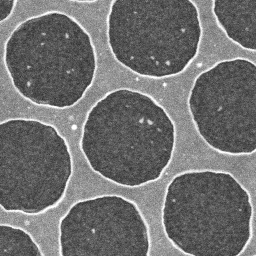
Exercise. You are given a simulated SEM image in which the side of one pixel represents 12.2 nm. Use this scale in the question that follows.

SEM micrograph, holes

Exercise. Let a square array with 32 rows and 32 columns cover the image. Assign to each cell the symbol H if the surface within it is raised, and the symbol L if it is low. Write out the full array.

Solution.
LLHHHHHHHHHHHHLLLLLLLLLLHHHLLLLL
LHHHHHHHHHHHHHLLLLLLLLLLLHHLLLLL
HHHHLLLLLHHHHHLLLLLLLLLLLHHLLLLL
HHLLLLLLLLHHHHLLLLLLLLLLLHHHLLLL
HLLLLLLLLLLHHHLLLLLLLLLLLHHHHLLL
HLLLLLLLLLLHHHLLLLLLLLLLLHHHHHLL
HLLLLLLLLLLLHHLLLLLLLLLLLHHHHHHH
HLLLLLLLLLLLHHHLLLLLLLLLHHHHHLHH
HLLLLLLLLLLLHHHHLLLLLLLHHHHLLLLL
HLLLLLLLLLLLHHHHHHHLLHHHHLLLLLLL
HHLLLLLLLLLHHHHHHHHHHHHHLLLLLLLL
HHHLLLLLLLLHHHLLLHHHHHHHLLLLLLLL
HHHHLLLLLLHHHLLLLLLHHHHHLLLLLLLL
HHHHHHHHHHHHLLLLLLLLHHHHLLLLLLLL
HHHHHHHHHHHLLLLLLLLLLHHHLLLLLLLL
LLLLLHHHHHHLLLLLLLLLLLHHLLLLLLLL
LLLLLLLHHHLLLLLLLLLLLLHHHLLLLLLL
LLLLLLLLHHLLLLLLLLLLLLHHHHLLLLLL
LLLLLLLLHHLLLLLLLLLLLLHHHHHLLLLL
LLLLLLLLLHHLLLLLLLLLLHHHHHHHHHHH
LLLLLLLLLHHLLLLLLLLLLHHHHHHHHHHH
LLLLLLLLLHHHLLLLLLLLHHHHHLHHHHHH
LLLLLLLLHHHHHHLLLLLHHHLLLLLLLHHH
LLLLLLLLHHHHHHHHHHHHHLLLLLLLLLHH
LLLLLLLLHHHHHHHHHHHHHLLLLLLLLLLH
LLLLLLLHHHLLLLLLLHHHHLLLLLLLLLLH
HHHLLHHHHLLLLLLLLHHHLLLLLLLLLLLH
HHHHHHHHLLLLLLLLLLHHLLLLLLLLLLLH
LLHHHHHHLLLLLLLLLLHHHLLLLLLLLLLH
LLLLHHHHLLLLLLLLLLHHHLLLLLLLLLLH
LLLLHHHHLLLLLLLLLLLHHHLLLLLLLLLH
LLLLLHHHLLLLLLLLLLHHHHHLLLLLLLHH